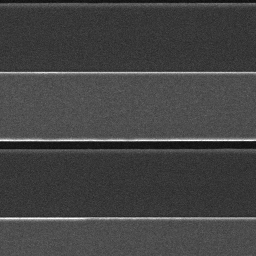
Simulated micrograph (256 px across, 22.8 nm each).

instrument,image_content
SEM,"lines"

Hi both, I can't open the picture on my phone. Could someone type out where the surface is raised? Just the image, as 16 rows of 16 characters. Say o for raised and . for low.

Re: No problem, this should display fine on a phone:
................
................
................
................
................
oooooooooooooooo
oooooooooooooooo
oooooooooooooooo
oooooooooooooooo
................
................
................
................
................
oooooooooooooooo
oooooooooooooooo